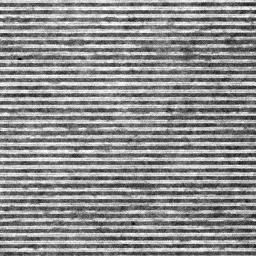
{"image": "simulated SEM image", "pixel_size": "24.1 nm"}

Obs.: parallel lines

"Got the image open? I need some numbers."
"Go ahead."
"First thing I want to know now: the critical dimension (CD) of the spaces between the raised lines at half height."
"5.12 px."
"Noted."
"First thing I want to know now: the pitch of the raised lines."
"0.182 um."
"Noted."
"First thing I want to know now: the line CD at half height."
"60.3 nm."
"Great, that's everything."